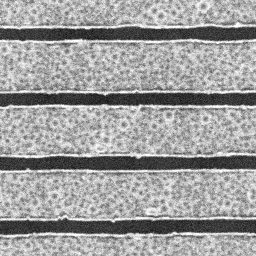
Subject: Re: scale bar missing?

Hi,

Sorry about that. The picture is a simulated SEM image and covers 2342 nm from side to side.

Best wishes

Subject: one or a few lines or trenches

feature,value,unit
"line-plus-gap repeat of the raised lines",581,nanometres